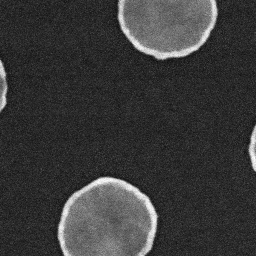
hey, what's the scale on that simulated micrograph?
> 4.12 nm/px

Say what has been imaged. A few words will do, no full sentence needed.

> raised bodies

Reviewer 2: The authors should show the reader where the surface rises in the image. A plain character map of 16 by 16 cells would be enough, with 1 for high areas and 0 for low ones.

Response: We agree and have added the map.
0000000111111000
0000000011111000
0000000011111000
0000000000100000
0000000000000000
0000000000000000
0000000000000000
0000000000000000
0000000000000000
0000000000000000
0000000000000000
0000001100000000
0000111110000000
0000111111000000
0000111111000000
0000111110000000